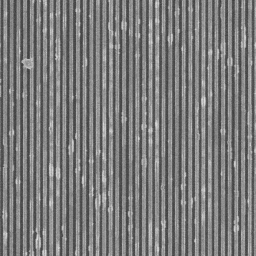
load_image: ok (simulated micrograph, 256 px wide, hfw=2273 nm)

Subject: parallel lines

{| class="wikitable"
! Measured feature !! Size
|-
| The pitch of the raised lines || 6.61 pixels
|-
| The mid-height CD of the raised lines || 30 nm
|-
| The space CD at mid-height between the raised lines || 3.38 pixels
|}